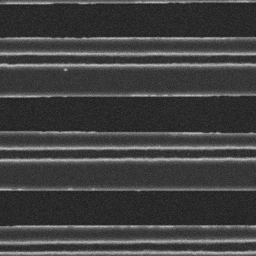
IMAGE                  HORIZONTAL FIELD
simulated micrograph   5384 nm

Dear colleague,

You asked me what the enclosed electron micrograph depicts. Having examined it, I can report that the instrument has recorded lines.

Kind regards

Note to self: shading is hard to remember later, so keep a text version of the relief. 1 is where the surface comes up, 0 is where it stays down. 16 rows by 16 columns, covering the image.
0000000000000000
0000000000000000
1111111111111111
1111111111111111
1111111111111111
1111111111111111
0000000000000000
0000000000000000
1111111111111111
1111111111111111
1111111111111111
1111111111111111
0000000000000000
0000000000000000
1111111111111111
1111111111111111